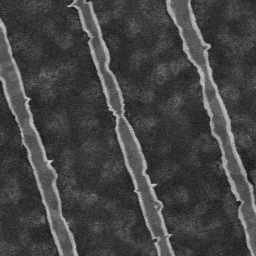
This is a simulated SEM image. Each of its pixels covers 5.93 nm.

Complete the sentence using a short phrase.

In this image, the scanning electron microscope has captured one or a few lines or trenches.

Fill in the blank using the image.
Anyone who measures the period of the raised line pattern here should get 547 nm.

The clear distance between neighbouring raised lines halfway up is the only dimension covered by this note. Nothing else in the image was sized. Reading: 455 nm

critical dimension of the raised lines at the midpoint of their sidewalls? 0.0879 microns